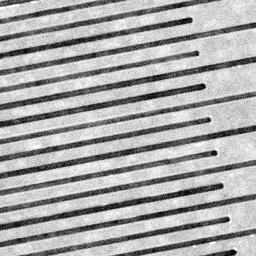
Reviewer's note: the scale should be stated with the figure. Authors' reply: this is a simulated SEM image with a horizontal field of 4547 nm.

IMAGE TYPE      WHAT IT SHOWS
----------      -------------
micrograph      parallel lines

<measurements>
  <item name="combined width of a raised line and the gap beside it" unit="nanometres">300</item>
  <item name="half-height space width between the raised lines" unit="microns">0.107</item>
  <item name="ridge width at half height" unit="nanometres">183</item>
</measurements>